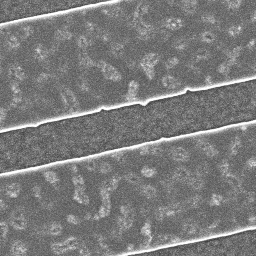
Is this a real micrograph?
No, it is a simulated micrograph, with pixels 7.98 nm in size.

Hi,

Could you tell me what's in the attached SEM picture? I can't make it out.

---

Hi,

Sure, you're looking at one or a few lines or trenches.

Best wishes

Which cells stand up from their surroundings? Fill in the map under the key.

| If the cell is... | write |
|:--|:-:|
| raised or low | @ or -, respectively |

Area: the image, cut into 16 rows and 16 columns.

-----@@@@@@@@@@@
@@@@@@@@@@@@@@@@
@@@@@@@@@@@@@@@@
@@@@@@@@@@@@@@@@
@@@@@@@@@@@@@@@@
@@@@@@@@@@@@@---
@@@@@@@@--------
@@@-------------
-----------@@@@@
-------@@@@@@@@@
--@@@@@@@@@@@@@@
@@@@@@@@@@@@@@@@
@@@@@@@@@@@@@@@@
@@@@@@@@@@@@@@@@
@@@@@@@@@@@@@@@-
@@@@@@@@@@------